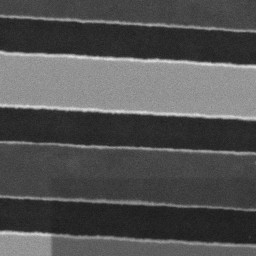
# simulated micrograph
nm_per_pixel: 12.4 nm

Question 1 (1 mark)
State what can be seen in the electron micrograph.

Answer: lines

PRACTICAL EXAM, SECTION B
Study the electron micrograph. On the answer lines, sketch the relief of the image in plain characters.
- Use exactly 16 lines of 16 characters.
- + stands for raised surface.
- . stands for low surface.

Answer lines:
++++++++++++++++
.......+++++++++
................
+++++...........
++++++++++++++++
++++++++++++++++
++++++++++++++++
................
................
+++++++++++++++.
++++++++++++++++
++++++++++++++++
...+++++++++++++
................
+...............
++++++++++++++++